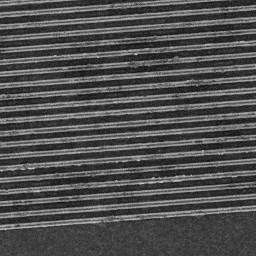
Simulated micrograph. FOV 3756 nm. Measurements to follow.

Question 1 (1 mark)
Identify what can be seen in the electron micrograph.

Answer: parallel lines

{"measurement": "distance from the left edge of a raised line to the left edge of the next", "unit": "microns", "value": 0.172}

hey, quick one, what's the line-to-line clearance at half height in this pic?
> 115 nanometers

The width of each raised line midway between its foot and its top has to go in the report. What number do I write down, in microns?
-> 0.0512